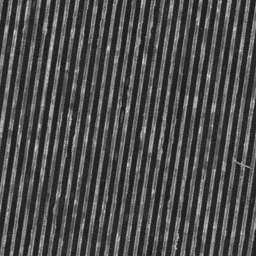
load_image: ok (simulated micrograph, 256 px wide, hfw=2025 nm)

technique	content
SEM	parallel lines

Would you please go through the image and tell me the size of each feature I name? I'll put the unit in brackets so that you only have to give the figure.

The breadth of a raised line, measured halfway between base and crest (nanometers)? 30.4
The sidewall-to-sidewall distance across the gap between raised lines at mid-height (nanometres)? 46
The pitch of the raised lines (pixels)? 9.42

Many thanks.